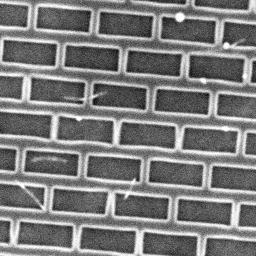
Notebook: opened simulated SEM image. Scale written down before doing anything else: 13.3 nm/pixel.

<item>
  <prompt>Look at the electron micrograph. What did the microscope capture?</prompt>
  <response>groups of lines, slits or small figures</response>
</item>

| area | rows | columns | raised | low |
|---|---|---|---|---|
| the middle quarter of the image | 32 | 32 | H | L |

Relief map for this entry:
LLLLLLLLLLLLLLHLLLLLLLLLLLLLLHHL
HHHHHHLLLLLLLLHLLLLLLLLLLLLLLHHL
HHHHHHHHHHHHHHHHHHLLLLLLLLLLLHHL
HHHHHHHHHHHHHHHHHHHHHHHHHHHHHHHL
LLLLLHHHHHHHHHHHHHHHHHHHHHHHHHHH
LLLLLHHLLLLLLLLLLHHHHHHHHHHHHHHH
LLLLLHHLLLLLLLLLLLLLLHHLLLLLHHHH
LLLLLHHLLLLLLLLLLLLLLHHLLLLLLLLL
LLLLLHHLLLLLLLLLLLLLLHHLLLLLLLLL
LLLLLHHLLLLLLLLLLLLLLHHLLLLLLLLL
HHHHHHHLLLLLLLLLLLLLLHHLLLLLLLLL
HHHHHHHHHHHHHHHHHHLLHHHLLLLLLLLL
HHHHHHHHHHHHHHHHHHHHHHHHHHHHHHHH
LLLHHHHHHHHHHHHHHHHHHHHHHHHHHHHH
LLLLLLLLLLLLLHHLLHHHHHHHHHHHHHHH
LLLLLLLLLLLLLHLLLLLLLLLLLLLLHHHH
LLLLLLLLLLLLLHLLLLLLLLLLLLLLHHLL
LLLLLLLLLLLLLHLLLLLLLLLLLLLLHHLL
LLLLLLLLLLLLLHLLLLLLLLLLLLLLHHLL
HHHHHHHHLLLLHHLLLLLLLLLLLLLLHLLL
HHHHHHHHHHHHHHLLLLLLLLLLLLLLHLLL
HHHHHHHHHHHHHHHHHHHHHHHHHHHHHHLL
LLLHHHHHHHHHHHHHHHHHHHHHHHHHHHHH
LLLLHHLLLLLLLLLLLHHHHHHHHHHHHHHH
LLLLHHLLLLLLLLLLLLLLHLLLLLLLLHHH
LLLLHHLLLLLLLLLLLLLHHLLLLLLLLLLL
LLLLHHLLLLLLLLLLLLLHHLLLLLLLLLLL
LLLLHHLLLLLLLLLLLLLHHLLLLLLLLLLL
HHHHHHHLLLLLLLLLLLLHHLLLLLLLLLLL
HHHHHHHHHHHHHHLLLHLHHLLLLLLLLLLL
HHHHHHHHHHHHHHHHHHHHHHHHHHHHHHLL
LLLLLLHHHHHHHHHHHHHHHHHHHHHHHHHH